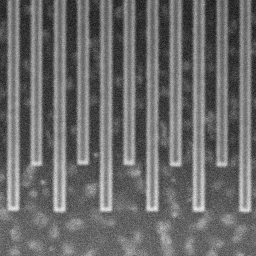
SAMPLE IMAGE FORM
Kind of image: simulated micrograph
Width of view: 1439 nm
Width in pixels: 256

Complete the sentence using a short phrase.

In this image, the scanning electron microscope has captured parallel lines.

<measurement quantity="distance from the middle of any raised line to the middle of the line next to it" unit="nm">130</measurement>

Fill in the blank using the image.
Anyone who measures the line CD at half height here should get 8.61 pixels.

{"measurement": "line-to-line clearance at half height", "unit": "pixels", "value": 14.6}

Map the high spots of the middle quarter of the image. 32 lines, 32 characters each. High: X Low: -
----XX---XXX---XX----XX----XX---
----XX---XXX---XX----XX----XX---
----XX---XXX---XX----XX----XX---
----XX---XXX---XX----XX----XX---
----XX---XXX---XX----XX----XX---
----XX---XXX---XX----XX----XX---
----XX---XXX---XX----XX----XX---
----XX---XXX---XX----XX----XX---
----XX---XXX---XX----XX----XX---
----XX---XXX---XX----XX----XX---
----XX---XXX---XX----XX----XX---
----XX---XXX---XX----XX----XX---
----XX---XXX---XX----XX----XX---
----XX---XXX---XX----XX----XX---
----XX---XXX---XX----XX----XX---
----XX---XXX---XX----XX----XX---
----XX---XXX---XX----XX----XX---
----XX---XXX---XX----XX----XX---
----XX---XXX---XX----XX----XX---
----XX---XXX---XX----XX----XX---
----XX---XXX---XX----XX----XX---
----XX---XXX---XX----XX----XX---
----XX---XXX---XX----XX----XX---
----XX---XXX---XX----XX----XX---
----XX---XXX---XX----XX----XX---
---------XXX---------XX---------
---------XXX---------XX---------
---------XXX---------XX---------
---------XXX---------XX---------
---------XXX---------XX---------
---------XXX---------XX---------
---------XXX---------XX---------